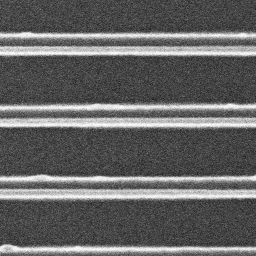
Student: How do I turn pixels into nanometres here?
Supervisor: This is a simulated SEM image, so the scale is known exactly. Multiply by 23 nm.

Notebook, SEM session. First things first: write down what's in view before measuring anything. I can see lines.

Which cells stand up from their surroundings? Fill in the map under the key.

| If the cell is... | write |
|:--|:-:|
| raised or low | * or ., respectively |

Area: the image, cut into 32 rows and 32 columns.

................................
................................
................................
................................
..***........................**.
********************************
********************************
................................
................................
................................
................................
................................
................................
.......**.**********************
********************************
****************************.***
................................
................................
................................
................................
................................
................................
..******************************
********************************
................................
................................
................................
................................
................................
................................
................................
********************************